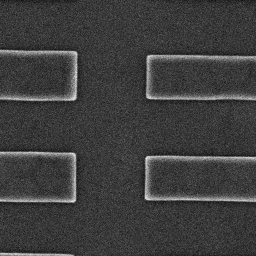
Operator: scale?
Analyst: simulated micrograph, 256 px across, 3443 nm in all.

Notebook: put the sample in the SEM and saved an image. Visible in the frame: wiring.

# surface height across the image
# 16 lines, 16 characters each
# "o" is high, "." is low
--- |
................
................
................
ooooo.....ooo...
ooooo....ooooooo
ooooo....ooooooo
................
................
................
................
ooooo....ooooooo
ooooo....ooooooo
oooo.........ooo
................
................
................